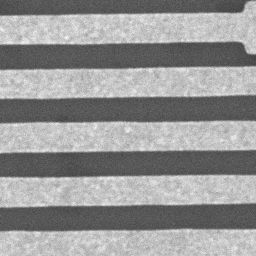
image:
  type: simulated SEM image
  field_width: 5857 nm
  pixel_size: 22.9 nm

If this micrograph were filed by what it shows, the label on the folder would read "wiring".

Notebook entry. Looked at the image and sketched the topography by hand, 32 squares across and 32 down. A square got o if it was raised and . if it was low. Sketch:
...............................o
..............................oo
oooooooooooooooooooooooooooooooo
oooooooooooooooooooooooooooooooo
oooooooooooooooooooooooooooooooo
..............................oo
...............................o
................................
.........................ooooooo
oooooooooooooooooooooooooooooooo
oooooooooooooooooooooooooooooooo
oooooooooooooooooooooooooooooooo
................................
................................
................................
oooooooooooooooooooooooooooooooo
oooooooooooooooooooooooooooooooo
oooooooooooooooooooooooooooooooo
oooooooooooooooooooooooooooooooo
................................
................................
................................
oooooooooooooooooooooooooooooooo
oooooooooooooooooooooooooooooooo
oooooooooooooooooooooooooooooooo
oooooooooooooooooo..oooo........
................................
................................
................................
oooooooooooooooooooooooooooooooo
oooooooooooooooooooooooooooooooo
oooooooooooooooooooooooooooooooo